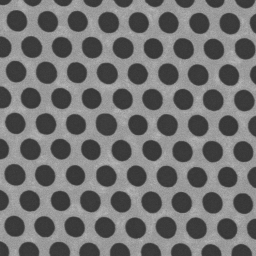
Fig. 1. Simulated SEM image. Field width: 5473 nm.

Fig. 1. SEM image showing a regular array of holes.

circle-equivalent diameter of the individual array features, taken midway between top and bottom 444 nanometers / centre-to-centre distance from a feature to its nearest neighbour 632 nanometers